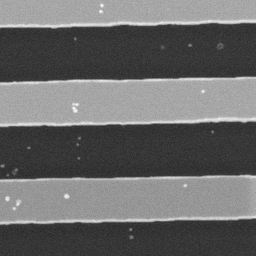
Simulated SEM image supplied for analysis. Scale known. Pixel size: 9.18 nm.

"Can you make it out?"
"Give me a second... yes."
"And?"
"lines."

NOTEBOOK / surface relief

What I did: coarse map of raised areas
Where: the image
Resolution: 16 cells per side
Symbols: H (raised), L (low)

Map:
HHHHHHHHHHHHHHHH
HHHHHHHHHHHHLLLL
LLLLLLLLLLLLLLLL
LLLLLLLLLLLLLLLL
LLLLLLLLLLLLLLLL
HHHHHHHHHHHHHHHH
HHHHHHHHHHHHHHHH
HHHHHHHHHHHHHHHH
LLLLLLLLLLLLLLLL
LLLLLLLLLLLLLLLL
LLLLLLLLLLLLLLLL
HHHHHHHHHHHHHHHH
HHHHHHHHHHHHHHHH
HHHHHHHHHHHHHHHH
LLLLLLLLLLLLLLLL
LLLLLLLLLLLLLLLL